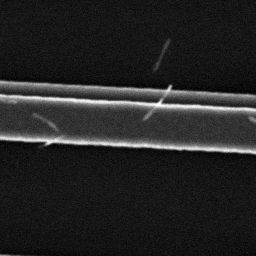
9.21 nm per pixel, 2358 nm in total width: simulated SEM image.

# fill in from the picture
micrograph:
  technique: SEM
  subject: lines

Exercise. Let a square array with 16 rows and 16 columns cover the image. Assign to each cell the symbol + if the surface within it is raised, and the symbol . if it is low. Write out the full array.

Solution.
................
................
................
................
................
+++++++.........
++++++++++++++++
++++++++++++++++
++++++++++++++++
...............+
................
................
................
................
................
................